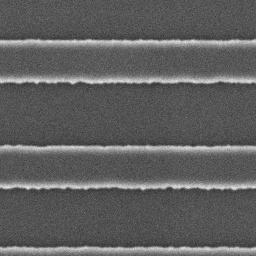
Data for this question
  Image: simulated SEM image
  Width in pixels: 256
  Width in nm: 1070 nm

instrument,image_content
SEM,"lines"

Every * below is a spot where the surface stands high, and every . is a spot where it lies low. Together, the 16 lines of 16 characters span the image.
................
................
.**..*.........*
****************
****************
................
................
................
................
****************
****************
****************
................
................
................
**.*****.******.